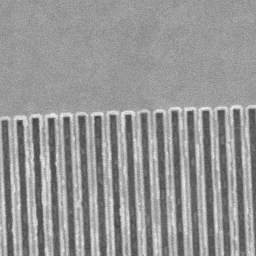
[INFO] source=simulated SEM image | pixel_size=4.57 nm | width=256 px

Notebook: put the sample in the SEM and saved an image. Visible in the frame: parallel lines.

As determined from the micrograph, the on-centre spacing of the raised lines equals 70.7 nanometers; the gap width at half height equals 8.49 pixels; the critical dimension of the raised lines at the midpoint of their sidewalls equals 0.0314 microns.